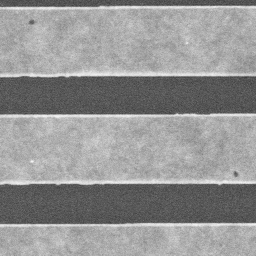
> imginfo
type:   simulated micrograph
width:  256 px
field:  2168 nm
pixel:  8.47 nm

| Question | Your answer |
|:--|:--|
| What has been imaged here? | lines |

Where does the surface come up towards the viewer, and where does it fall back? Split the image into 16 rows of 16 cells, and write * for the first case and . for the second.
****************
****************
****************
****************
****************
................
................
****************
****************
****************
****************
................
................
................
****************
****************